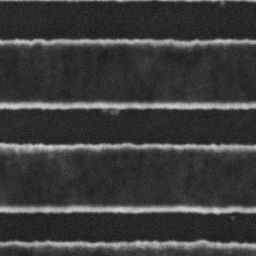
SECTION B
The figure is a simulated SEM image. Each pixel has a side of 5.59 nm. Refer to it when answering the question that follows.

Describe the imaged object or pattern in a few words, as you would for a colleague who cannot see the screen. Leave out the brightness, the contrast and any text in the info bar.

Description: lines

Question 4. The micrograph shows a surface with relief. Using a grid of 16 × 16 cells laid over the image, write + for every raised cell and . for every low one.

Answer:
................
................
..+.++++.+...++.
++++++++++++++++
++++++++++++++++
++++++++++++++++
++++++++++++++++
................
................
++++++++++++++++
++++++++++++++++
++++++++++++++++
++++++++++++++++
................
................
++++++++++++++++